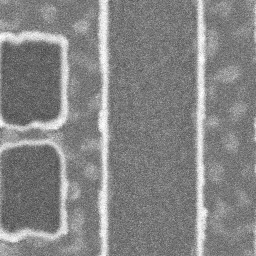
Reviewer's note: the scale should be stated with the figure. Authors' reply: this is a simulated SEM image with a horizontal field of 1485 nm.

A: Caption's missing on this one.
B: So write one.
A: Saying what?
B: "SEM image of one or a few lines or trenches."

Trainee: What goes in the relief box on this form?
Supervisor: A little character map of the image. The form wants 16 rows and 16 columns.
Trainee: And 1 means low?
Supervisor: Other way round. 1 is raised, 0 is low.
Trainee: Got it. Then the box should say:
1111111000000111
1111111000000111
0001111000000111
0000111000000111
0000111000000111
0000111000000111
0000111000001111
0001111000001111
1111111000000111
0000111000001111
0000111000001111
0000111000000111
0000110000000111
0000111000000111
0000111000001111
1111111000001111